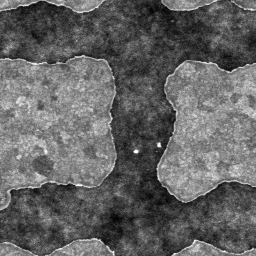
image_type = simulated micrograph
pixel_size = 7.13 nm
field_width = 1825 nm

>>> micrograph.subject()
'raised bodies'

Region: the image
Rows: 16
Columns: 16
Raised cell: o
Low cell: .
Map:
o...oo.....o...o
................
................
................
ooooooo....ooooo
ooooooo...oooooo
ooooooo....ooooo
ooooooo....ooooo
ooooooo....ooooo
ooooooo...oooooo
ooooooo...oooooo
ooo.oo....oooo.o
o..........o....
................
................
o...ooo.....oo..